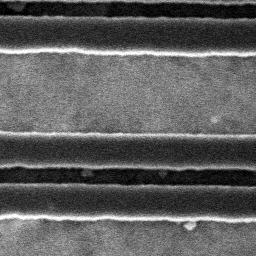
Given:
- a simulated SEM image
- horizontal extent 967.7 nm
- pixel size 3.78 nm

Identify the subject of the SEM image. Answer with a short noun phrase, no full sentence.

lines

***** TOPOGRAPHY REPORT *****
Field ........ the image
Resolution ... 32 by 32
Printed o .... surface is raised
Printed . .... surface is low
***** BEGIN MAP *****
...........................ooo..
................................
oooooooooooooooooooooooooooooooo
oooooooooooooooooooooooooooooooo
oooooooooooooooooooooooooooooooo
oooooooooooooooooooooooooooooooo
oooo...o..oooooooooooooooooooooo
................................
................................
................................
................................
................................
................................
................................
................................
................................
o...............................
oooooooooooooooooooooooooooooooo
oooooooooooooooooooooooooooooooo
oooooooooooooooooooooooooooooooo
oooooooooooooooooooooooooooooooo
................................
................................
oooooooooooooooooooooooooooooooo
oooooooooooooooooooooooooooooooo
oooooooooooooooooooooooooooooooo
oooooooooooooooooooooooooooooooo
............................oooo
................................
................................
................................
................................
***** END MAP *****